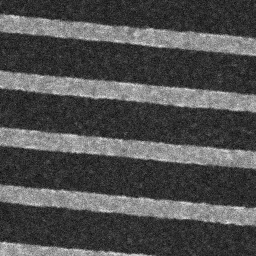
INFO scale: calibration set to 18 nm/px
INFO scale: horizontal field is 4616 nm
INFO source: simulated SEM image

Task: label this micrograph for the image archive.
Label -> parallel lines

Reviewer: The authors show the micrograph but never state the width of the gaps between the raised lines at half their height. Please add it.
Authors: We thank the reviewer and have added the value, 39.9 pixels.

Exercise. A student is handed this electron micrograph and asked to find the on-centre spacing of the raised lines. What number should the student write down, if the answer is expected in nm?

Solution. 1020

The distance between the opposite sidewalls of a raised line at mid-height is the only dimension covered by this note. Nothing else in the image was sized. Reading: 298 nm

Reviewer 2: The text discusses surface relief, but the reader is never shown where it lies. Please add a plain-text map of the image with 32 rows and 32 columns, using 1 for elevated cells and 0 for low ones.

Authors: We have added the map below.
00000000000000000000000000000000
00000000000000000000000000000000
11111100000000000000000000000000
11111111111111110000000000000000
00000011111111111111111111111000
00000000000000000111111111111111
00000000000000000000000000001111
00000000000000000000000000000000
00000000000000000000000000000000
11111000000000000000000000000000
11111111111111110000000000000000
00000111111111111111111111110000
00000000000000011111111111111111
00000000000000000000000000011111
00000000000000000000000000000000
00000000000000000000000000000000
11111000000000000000000000000000
11111111111111100000000000000000
00001111111111111111111111000000
00000000000000011111111111111111
00000000000000000000000001111111
00000000000000000000000000000000
00000000000000000000000000000000
11100000000000000000000000000000
11111111111111000000000000000000
00011111111111111111111111000000
00000000000000111111111111111111
00000000000000000000000001111111
00000000000000000000000000000000
00000000000000000000000000000000
11000000000000000000000000000000
11111111111110000000000000000000